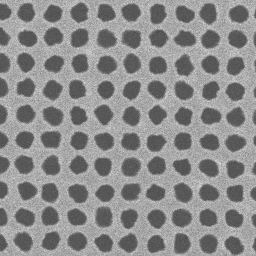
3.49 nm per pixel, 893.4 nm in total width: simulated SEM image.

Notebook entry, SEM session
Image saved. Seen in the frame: a regular array of holes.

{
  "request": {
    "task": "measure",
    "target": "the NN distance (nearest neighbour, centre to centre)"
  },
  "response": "86.4 nanometres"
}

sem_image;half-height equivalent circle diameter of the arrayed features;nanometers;60.9